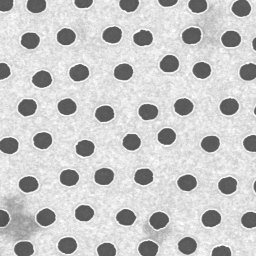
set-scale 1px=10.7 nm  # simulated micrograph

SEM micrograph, a regular array of holes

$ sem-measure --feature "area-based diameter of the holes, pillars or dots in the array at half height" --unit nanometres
195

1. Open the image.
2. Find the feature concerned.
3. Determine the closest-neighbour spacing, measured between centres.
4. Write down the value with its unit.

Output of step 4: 35.7 pixels